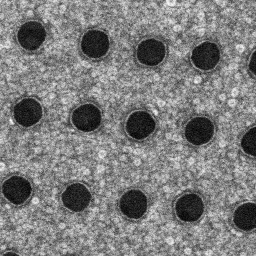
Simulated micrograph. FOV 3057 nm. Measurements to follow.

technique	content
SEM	a regular array of raised bodies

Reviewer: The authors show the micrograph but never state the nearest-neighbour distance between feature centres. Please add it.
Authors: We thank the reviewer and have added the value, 672 nm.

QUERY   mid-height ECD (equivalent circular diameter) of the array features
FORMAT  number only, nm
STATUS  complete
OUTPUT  364